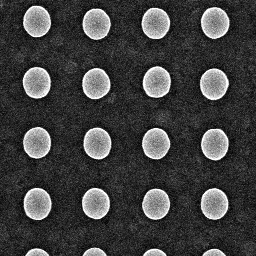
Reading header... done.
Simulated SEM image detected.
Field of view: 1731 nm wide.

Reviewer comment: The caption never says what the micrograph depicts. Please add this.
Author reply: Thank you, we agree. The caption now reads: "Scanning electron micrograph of a regular array of raised bodies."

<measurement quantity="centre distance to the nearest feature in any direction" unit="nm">397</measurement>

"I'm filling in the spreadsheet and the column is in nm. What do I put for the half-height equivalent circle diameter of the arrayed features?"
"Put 196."